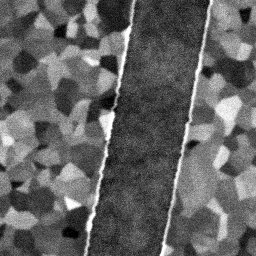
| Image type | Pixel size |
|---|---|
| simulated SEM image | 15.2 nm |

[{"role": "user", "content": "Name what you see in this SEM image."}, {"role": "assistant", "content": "one or a few lines or trenches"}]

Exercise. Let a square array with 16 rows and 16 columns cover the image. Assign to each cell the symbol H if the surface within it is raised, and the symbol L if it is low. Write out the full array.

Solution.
HHHHHHHHLLLLLHHH
HHHHHHHHLLLLLHHH
HHHHHHHHLLLLLHHH
HHHHHHHHLLLLLHHH
HHHHHHHHLLLLHHHH
HHHHHHHLLLLLHHHH
HHHHHHHLLLLLHHHH
HHHHHHHLLLLLHHHH
HHHHHHHLLLLLHHHH
HHHHHHHLLLLHHHHH
HHHHHHLLLLLHHHHH
HHHHHHLLLLLHHHHH
HHHHHHLLLLLHHHHH
HHHHHHLLLLLHHHHH
HHHHHHLLLLHHHHHH
HHHHHLLLLLHHHHHH